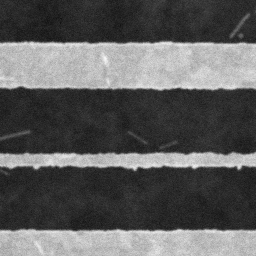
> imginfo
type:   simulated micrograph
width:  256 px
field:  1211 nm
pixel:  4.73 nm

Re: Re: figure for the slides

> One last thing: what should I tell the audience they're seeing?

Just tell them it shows lines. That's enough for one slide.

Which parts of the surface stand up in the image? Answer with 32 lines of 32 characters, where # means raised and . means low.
................................
................................
................................
................................
................................
.####.....#.##..#..###..........
################################
################################
################################
################################
################################
................................
................................
................................
................................
................................
................................
................................
................................
################################
################################
................................
................................
................................
................................
................................
................................
................................
................................
################################
################################
################################